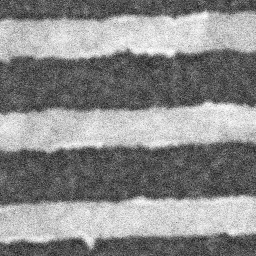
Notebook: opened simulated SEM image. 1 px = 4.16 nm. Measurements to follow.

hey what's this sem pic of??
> one or a few lines or trenches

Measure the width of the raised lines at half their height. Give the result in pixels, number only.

34.7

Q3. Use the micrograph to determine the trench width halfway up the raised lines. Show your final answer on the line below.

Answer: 238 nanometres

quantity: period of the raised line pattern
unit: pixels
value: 91.8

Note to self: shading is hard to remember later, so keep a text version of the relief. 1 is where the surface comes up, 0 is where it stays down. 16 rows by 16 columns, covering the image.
0000000000000000
1111111111111111
1111111111111111
1001110000000000
0000000000000000
0000000000000000
0000000000000000
1111111111111111
1111111111111111
0000000000000000
0000000000000000
0000000000000000
0000000010100111
1111111111111111
1111111111111111
0000000000000000